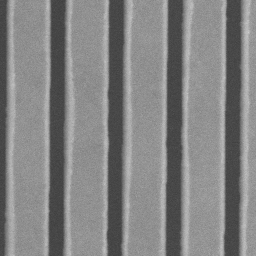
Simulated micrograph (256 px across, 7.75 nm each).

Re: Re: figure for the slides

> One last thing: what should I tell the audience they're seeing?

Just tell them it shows lines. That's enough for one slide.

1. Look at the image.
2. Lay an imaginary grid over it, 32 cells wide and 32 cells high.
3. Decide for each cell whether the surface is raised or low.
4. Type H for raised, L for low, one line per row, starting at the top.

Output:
LHHHHHLLHHHHHHLLHHHHHLLHHHHHLLHH
LHHHHHLLHHHHHHLLHHHHHLLHHHHHLLHH
LHHHHHLLHHHHHHLLHHHHHLLHHHHHLLHH
LHHHHHLLHHHHHHLLHHHHHLLHHHHHLLHH
LHHHHHLLHHHHHHLLHHHHHLLHHHHHLLHH
LHHHHHLLHHHHHHLLHHHHHLLHHHHHLLHH
LHHHHHLLHHHHHHLLHHHHHLLHHHHHLLHH
LHHHHHLLHHHHHHLLHHHHHLLHHHHHLLHH
LHHHHHLLHHHHHHLLHHHHHLLHHHHHLLHH
LHHHHHLLHHHHHHLLHHHHHLLHHHHHLLHH
LHHHHHLLHHHHHHLLHHHHHLLHHHHHLLHH
LHHHHHLLHHHHHHLLHHHHHLLHHHHHLLHH
LHHHHHLLHHHHHLLLHHHHHLLHHHHHLLHH
LHHHHHLLHHHHHHLLHHHHHLLHHHHHLLHH
LHHHHHLLHHHHHHLLHHHHHLLHHHHHLLHH
LHHHHHLLHHHHHLLLHHHHHLLHHHHHLLHH
LHHHHHLLHHHHHLLLHHHHHLLHHHHHLLHH
LHHHHHLLHHHHHHLLHHHHHLLHHHHHLLHH
LHHHHHLLHHHHHHLLHHHHHLLHHHHHLLHH
LHHHHHLLHHHHHLLLHHHHHLLHHHHHLLHH
LHHHHHLLHHHHHLLLHHHHHLLHHHHHLLHH
LHHHHHLLHHHHHLLLHHHHHLLHHHHHLLHH
LHHHHHLLHHHHHLLLHHHHHLLHHHHHLLHH
LHHHHHLLHHHHHLLLHHHHHLLHHHHHLLHH
LHHHHHLLHHHHHLLHHHHHHLLHHHHHLLHH
LHHHHHLLHHHHHLLHHHHHHLLHHHHHLLHH
LHHHHHLLHHHHHLLHHHHHHLLHHHHHLLHH
LHHHHHLLHHHHHLLHHHHHHLLHHHHHLLHH
LHHHHHLLHHHHHLLHHHHHHLLHHHHHLLHH
LHHHHHLLHHHHHLLHHHHHHLLHHHHHLLHH
LHHHHHLLHHHHHLLHHHHHHLLHHHHHLLHH
LHHHHHLLHHHHHLLHHHHHHLLHHHHHLLHH